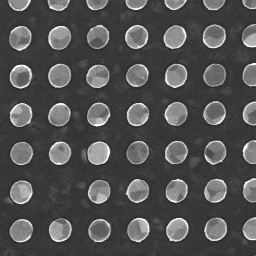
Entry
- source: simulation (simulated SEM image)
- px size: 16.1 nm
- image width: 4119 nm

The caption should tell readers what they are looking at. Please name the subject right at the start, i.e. a regular array of raised bodies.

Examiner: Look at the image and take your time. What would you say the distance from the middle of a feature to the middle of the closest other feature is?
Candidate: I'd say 616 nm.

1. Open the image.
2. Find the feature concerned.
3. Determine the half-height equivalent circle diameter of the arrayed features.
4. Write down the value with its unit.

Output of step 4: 364 nanometres